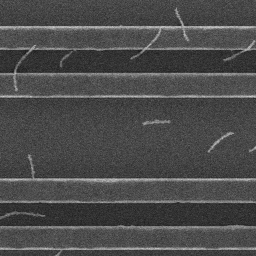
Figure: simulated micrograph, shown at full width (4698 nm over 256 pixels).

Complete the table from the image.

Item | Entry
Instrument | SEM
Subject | lines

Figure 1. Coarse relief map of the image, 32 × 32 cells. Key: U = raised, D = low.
DDDDDDDDDDDDDDDDDDDDDDDDDDDDDDDD
DDDDDDDDDDDDDDDDDDDDDDDDDDDDDDDD
DDDDDDDDDDDDDDDDDDDDDDDDDDDDDDDD
UUUUUUUUUUUUUUUUUUUUUUUUUUUUUUUU
UUUUUUUUUUUUUUUUUUUUUUUUUUUUUUUU
UUUUUUUUUUUUUUUUUUUUUUUUUUUUUUUU
DDDDDDDDDDDDDDDDDDDDDDDDDDDDDDDD
DDDDDDDDDDDDDDDDDDDDDDDDDDDDDDDD
DDDDDDDDDDDDDDDDDDDDDDDDDDDDDDDD
UUUUUUUUUUUUUUUUUUUUUUUUUUUUUUUU
UUUUUUUUUUUUUUUUUUUUUUUUUUUUUUUU
UUUUUUUUUUUUUUUUUUUUUUUUUUUUUUUU
DDDDDDDDDDDDDDDDDDDDDDDDDDDDDDDD
DDDDDDDDDDDDDDDDDDDDDDDDDDDDDDDD
DDDDDDDDDDDDDDDDDDDDDDDDDDDDDDDD
DDDDDDDDDDDDDDDDDDDDDDDDDDDDDDDD
DDDDDDDDDDDDDDDDDDDDDDDDDDDDDDDD
DDDDDDDDDDDDDDDDDDDDDDDDDDDDDDDD
DDDDDDDDDDDDDDDDDDDDDDDDDDDDDDDD
DDDDDDDDDDDDDDDDDDDDDDDDDDDDDDDD
DDDDDDDDDDDDDDDDDDDDDDDDDDDDDDDD
DDDDDDDDDDDDDDDDDDDDDDDDDDDDDDDD
UUUUUUUUUUUUDDUUUUUUUUUUUUUUUUUU
UUUUUUUUUUUUUUUUUUUUUUUUUUUUUUUU
UUUUUUUUUUUUUUUUUUUUUUUUUUUUUUUU
DDDDDDDDDDDDDDDDDDDDDDDDDDDDDDDD
DDDDDDDDDDDDDDDDDDDDDDDDDDDDDDDD
DDDDDDDDDDDDDDDDDDDDDDDDDDDDDDDD
UUUUUUUUUUUUUUUUUUUUUUUUUUUUUUUU
UUUUUUUUUUUUUUUUUUUUUUUUUUUUUUUU
UUUUUUUUUUUUUUUUUUUUUUUUUUUUUUUU
DDDDDDDDDDDDDDDDDDDDDDDDDDDDDDDD